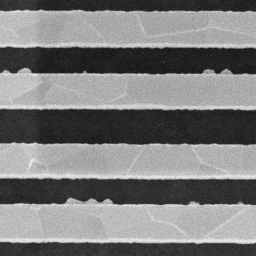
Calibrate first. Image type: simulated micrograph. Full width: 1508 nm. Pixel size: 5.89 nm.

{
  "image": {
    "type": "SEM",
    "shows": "lines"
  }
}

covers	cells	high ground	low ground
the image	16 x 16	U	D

DDDDDDDDDDDDDDDD
UUUUUUUUUUUUUUUU
UUUUUUUUUUUUUUUU
DDDDDDDDDDDDDDDD
DDDDDDDDDDDDDDDD
UUUUUUUUUUUUUUUU
UUUUUUUUUUUUUUUU
DDDDDDDDDDDDDDDD
DDDDDDDDDDDDDDDD
UUUUUUUUUUUUUUUU
UUUUUUUUUUUUUUUU
DDDDDDDDDDDDDDDD
DDDDDDDDDDDDDDDD
UUUUUUUUUUUUUUUU
UUUUUUUUUUUUUUUU
DDDDDDDDDDDDDDDD